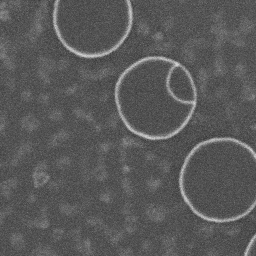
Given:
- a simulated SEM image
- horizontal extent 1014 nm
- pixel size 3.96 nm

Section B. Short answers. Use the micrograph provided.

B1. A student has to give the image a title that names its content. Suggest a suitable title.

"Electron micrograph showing raised bodies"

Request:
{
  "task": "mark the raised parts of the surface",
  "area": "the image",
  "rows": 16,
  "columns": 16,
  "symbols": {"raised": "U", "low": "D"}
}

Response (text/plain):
DDDUUUUUDDDDDDDD
DDDUUUUUDDDDDDDD
DDDDUUUUDDDDDDDD
DDDDDUDDDDDDDDDD
DDDDDDDDUUUDDDDD
DDDDDDDUUUUDDDDD
DDDDDDDUUUUUDDDD
DDDDDDDDUUUUDDDD
DDDDDDDDDUUDDDDD
DDDDDDDDDDDDUUUU
DDDDDDDDDDDUUUUU
DDDDDDDDDDDUUUUU
DDDDDDDDDDDDUUUU
DDDDDDDDDDDDDUUD
DDDDDDDDDDDDDDDD
DDDDDDDDDDDDDDDU